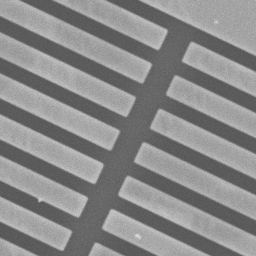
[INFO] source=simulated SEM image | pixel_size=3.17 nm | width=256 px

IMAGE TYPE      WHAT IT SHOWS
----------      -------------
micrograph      groups of lines, slits or small figures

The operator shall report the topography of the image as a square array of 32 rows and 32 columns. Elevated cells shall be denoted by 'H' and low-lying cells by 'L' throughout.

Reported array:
HHHLLLLLHHHHHHLLLLHHHHHHHHHHHHHH
HHHHHLLLLLHHHHHHLLLLHHHHHHHHHHHH
LHHHHHHHLLLLHHHHHHLLLLLHHHHHHHHH
LLLHHHHHHHLLLLHHHHHHLLLLLHHHHHHH
HLLLLHHHHHHHLLLLHHHHHLLLLLLHHHHH
HHHLLLLHHHHHHHLLLLHHLLLLHLLLLHHH
HHHHHLLLLHHHHHHHLLLLLLLHHHHLLLLH
LHHHHHHLLLLLHHHHHHLLLLLHHHHHHLLL
LLLHHHHHHLLLLLHHHHHLLLLLHHHHHHHL
HLLLLHHHHHHLLLLLHHLLLLLLLLLHHHHH
HHHLLLLHHHHHHHLLLLLLLHHHLLLLLHHH
HHHHHLLLLHHHHHHHLLLLLHHHHHLLLLLH
HHHHHHHLLLLHHHHHHLLLLLHHHHHHLLLL
LLLHHHHHHLLLLHHHLLLLLLLLHHHHHHHL
LLLLLHHHHHHLLLLLLLLHHHLLLLHHHHHH
HHLLLLLHHHHHHLLLLLLHHHHHLLLLHHHH
HHHHHLLLLHHHHHHLLLLLHHHHHHLLLLHH
HHHHHHHLLLLHHHLLLLLLLLHHHHHHLLLL
LLHHHHHHHLLLLHLLLLHHLLLLHHHHHHLL
LLLLHHHHHHHLLLLLLHHHHHLLLLHHHHHH
HHLLLLLHHHHHHLLLLHHHHHHHLLLLHHHH
HHHHLLLLLHHHHLLLLLLHHHHHHHLLLLHH
HHHHHHLLLLLHLLLLHLLLLHHHHHHHLLLL
LLHHHHHHLLLLLLLHHHHLLLLLHHHHHHLL
LLLLHHHHHHLLLLLHHHHHHLLLLLHHHHHH
HHLLLLHHHHHLLLLLLHHHHHHLLLLLHHHH
HHHHLLLLHHLLLLHLLLLHHHHHHLLLLLHH
HHHHHHLLLLLLLHHHHLLLLHHHHHHHLLLL
LLHHHHHHLLLLLHHHHHHLLLLHHHHHHHLL
LLLLHHHHHLLLLLLHHHHHHLLLLHHHHHHH
HHLLLLHHLLLLLLLLLHHHHHHLLLLLHHHH
HHHHLLLLLLLHHHLLLLLHHHHHHLLLLLHH